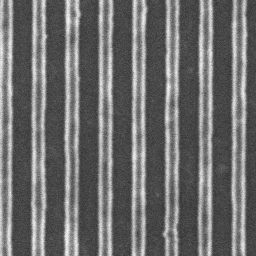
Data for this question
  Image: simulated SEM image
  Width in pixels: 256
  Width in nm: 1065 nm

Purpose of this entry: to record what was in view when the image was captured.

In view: parallel lines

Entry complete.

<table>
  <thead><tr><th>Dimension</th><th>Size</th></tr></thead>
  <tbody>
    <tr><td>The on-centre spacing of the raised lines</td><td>139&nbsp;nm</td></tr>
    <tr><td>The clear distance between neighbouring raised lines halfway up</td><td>95.7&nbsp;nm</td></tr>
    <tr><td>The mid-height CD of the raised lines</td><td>42.1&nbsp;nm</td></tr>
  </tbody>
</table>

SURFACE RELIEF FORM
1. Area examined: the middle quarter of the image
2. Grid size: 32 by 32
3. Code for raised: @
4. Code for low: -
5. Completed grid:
-@@------@@------@@@------@@----
-@@------@@-------@@------@@----
-@@------@@@------@@------@@----
-@@------@@@------@@------@@----
-@@------@@@------@@------@@----
-@@------@@-------@@------@@----
-@@------@@-------@@------@@----
-@@------@@-------@@------@@----
-@@------@@@------@@------@@----
-@@------@@@-----@@@------@@----
-@@------@@@-----@@@------@@----
-@@------@@@-----@@@------@@----
-@@------@@@-----@@@------@@----
-@@------@@@-----@@@------@@----
-@@------@@@-----@@@------@@----
-@@------@@@------@@------@@----
-@@------@@@-----@@@------@@----
-@@------@@@-----@@@------@@----
-@@------@@@------@@------@@----
-@@------@@@------@@------@@----
-@@------@@@------@@------@@----
-@@------@@@-----@@@------@@----
-@@------@@@-----@@@------@@----
-@@------@@@------@@------@@----
-@@------@@@------@@------@@----
-@@------@@@------@@------@@----
-@@------@@@------@@------@@----
-@@------@@@------@@------@@----
-@@------@@@------@@------@@----
-@@------@@@------@@------@@----
-@@------@@@------@@------@@----
-@@------@@@------@@------@@----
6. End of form